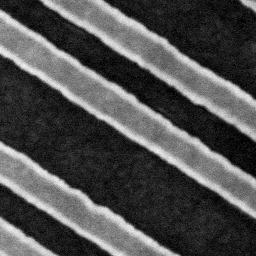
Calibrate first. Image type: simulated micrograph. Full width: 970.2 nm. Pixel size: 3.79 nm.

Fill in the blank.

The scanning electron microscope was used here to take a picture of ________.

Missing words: lines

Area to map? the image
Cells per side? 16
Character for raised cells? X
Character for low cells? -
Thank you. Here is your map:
---XXXX---------
X----XXXX-------
XXX---XXXX------
XXXX----XXXX----
--XXXX---XXXX---
----XXX----XXXX-
-----XXXX----XXX
------XXXX----XX
--------XXXX----
X---------XXX---
XXX--------XXXX-
XXXX---------XXX
--XXXX--------XX
---XXXX---------
X----XXXX-------
XXX---XXXX------